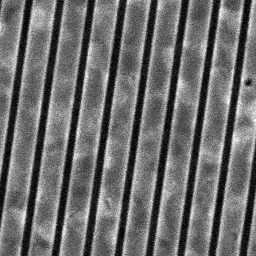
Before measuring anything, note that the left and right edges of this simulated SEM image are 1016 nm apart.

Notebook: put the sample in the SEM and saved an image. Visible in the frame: parallel lines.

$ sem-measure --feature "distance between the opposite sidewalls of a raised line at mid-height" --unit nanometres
87.5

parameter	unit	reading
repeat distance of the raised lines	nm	123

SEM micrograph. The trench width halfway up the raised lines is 34.4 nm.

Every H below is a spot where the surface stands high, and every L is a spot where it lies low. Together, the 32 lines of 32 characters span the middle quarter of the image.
HHHLLLHHHHHLLLHHHHHLLHHHHHHLLHHH
HHHLLLHHHHHLLLHHHHHLLHHHHHHLLHHH
HHHLLLHHHHHLLHHHHHHLLHHHHHHLLHHH
HHHLLHHHHHHLLHHHHLHLLHHHHHLLLHHH
HHHLLHHHHHHLLHHHHHHLLHHHHHLLLHHH
HHHLLHHHHHLLLHHHHHLLLHHHHHLLHHHH
HHHLLHHHHHLLLHHHHHLLLHHHHHLLHHHH
HHLLLHHHHHLLLHHHHHLLHHHHHHLLHHHH
HHLLLHHHHHLLHHLHHHLLHHHHHHLLHHHH
HHLLLHHHHHLLHHHHHHLLHHHHHHLLHHHH
HHLLHHHHHHLLHHHHHHLLHHHHHLLLHHHH
HHLLHHHHHHLLHHHHHHLLHHHHHLLLHHHH
HHLLHHHHHLLLHHHHHLLLHHHHHLLHHHHH
HHLLHHHHHLLLHHHHHLLLHHHHHLLHHHHH
HLLLHHHLHLLLHHHHHLLHHHHHHLLHHHHH
HLLLHHHHHLLHHHHHHLLHHHHHHLLHHHHH
HLLLHHHHHLLHHHHHHLLHHHHHHLLHHHHH
HLLHHHHHHLLHHHHHHLLHHHHHLLLHHHHH
HLLHHHHHHLLHHHHHHLLHHHHHLLLHHHHH
HLLHHHHHLLLHHHHHLLLHHHHHLLHHHHHH
HLLHHHHHLLLHHHHHLLLHHHHHLLHHHHHH
LLLHHHHHLLLHHHHHLLHHHHHHLLHHHHHH
LLLHHHHHLLHHHHHHLLHHHHHHLLHHHHHL
LLLHHHHHLLHHHHHHLLHHLHHHLLHHHHHL
LLHHHHHHLLHHHHHHLLHHHHHLLLHHHHHL
LLHHHHHHLLHHHHHHLLHHHHHLLLHHHHHL
LLHHHHHLLLHHHHHLLLHHHHHLLHHHHHHL
LLHHHHHLLLHHHHHLLLHHHHHLLHHHHHHL
LLHHHHHLLLHHHHHLLHHHHHHLLHHHHHHL
LLHHHHHLLLHHHHHLLHHHHHHLLHHHHHHL
LLHHHHHLLHHHHHHLLHHHHHHLLHHHHHHL
LHHHHHHLLHHHHHHLLHHHHHLLLHHHHHLL